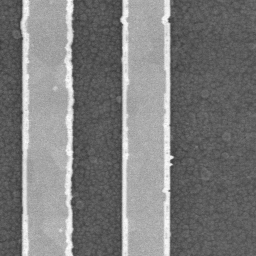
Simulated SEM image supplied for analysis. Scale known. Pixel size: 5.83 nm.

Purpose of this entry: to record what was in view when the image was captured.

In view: one or a few lines or trenches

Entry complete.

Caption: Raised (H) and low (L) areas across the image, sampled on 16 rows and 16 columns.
LLHHLLLLHHHLLLLL
LHHHLLLLHHLLLLLL
LLHHLLLLHHHLLLLL
LLHHLLLLHHHLLLLL
LLHHLLLLHHHLLLLL
LLHHLLLLHHHLLLLL
LLHHLLLLHHLLLLLL
LLHHLLLLHHLLLLLL
LLHHLLLLHHLLLLLL
LLHHLLLLHHHLLLLL
LLHHLLLLHHHLLLLL
LLHHLLLLHHLLLLLL
LLHHLLLLHHLLLLLL
LHHHLLLLHHHLLLLL
LHHHLLLLHHHLLLLL
LHHHLLLLHHLLLLLL